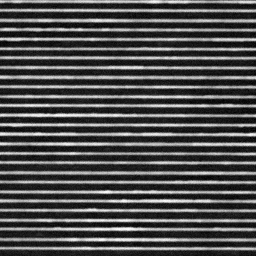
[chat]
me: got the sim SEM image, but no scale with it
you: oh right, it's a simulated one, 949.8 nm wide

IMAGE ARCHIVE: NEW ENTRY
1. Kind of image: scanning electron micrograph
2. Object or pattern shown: parallel lines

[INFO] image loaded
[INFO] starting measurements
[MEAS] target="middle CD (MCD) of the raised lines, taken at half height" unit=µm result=0.007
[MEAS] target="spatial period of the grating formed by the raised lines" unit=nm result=35.3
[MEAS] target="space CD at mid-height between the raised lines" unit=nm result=26.9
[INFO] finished